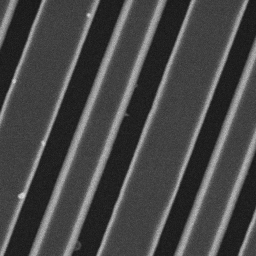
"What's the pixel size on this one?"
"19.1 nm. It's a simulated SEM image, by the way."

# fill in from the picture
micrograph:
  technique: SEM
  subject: lines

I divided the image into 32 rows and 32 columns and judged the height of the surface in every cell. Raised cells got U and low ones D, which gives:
UUDDDUUUUUUUDDDDUUUUDDDDUUUUUUUD
UUDDDUUUUUUUDDDUUUUUDDDUUUUUUUUD
UDDDUUUUUUUUDDDUUUUUDDDUUUUUUUDD
UDDDUUUUUUUDDDUUUUUDDDDUUUUUUUDD
DDDDUUUUUUUDDDUUUUUDDDUUUUUUUDDD
DDDUUUUUUUDDDDUUUUUDDDUUUUUUUDDD
DDDUUUUUUUDDDUUUUUDDDDUUUUUUUDDU
DDUUUUUUUUDDDUUUUUDDDUUUUUUUDDDU
DDUUUUUUUDDDDUUUUUDDDUUUUUUUDDDU
DDUUUUUUUDDDUUUUUDDDUUUUUUUUDDUU
DUUUUUUUUDDDUUUUUDDDUUUUUUUDDDUU
DUUUUUUUDDDDUUUUDDDDUUUUUUUDDDUU
DUUUUUUUDDDUUUUUDDDUUUUUUUDDDUUU
UUUUUUUDDDDUUUUUDDDUUUUUUUDDDUUU
UUUUUUUDDDUUUUUDDDDUUUUUUUDDUUUU
UUUUUUUDDDUUUUUDDDUUUUUUUDDDUUUU
UUUUUUDDDDUUUUUDDDUUUUUUUDDDUUUU
UUUUUUDDDUUUUUDDDUUUUUUUUDDUUUUU
UUUUUUDDDUUUUUDDDUUUUUUUDDDUUUUU
UUUUUDDDUUUUUDDDDUUUUUUUDDDUUUUU
UUUUUDDDUUUUUDDDUUUUUUUDDDUUUUUD
UUUUDDDDUUUUUDDDUUUUUUUDDDUUUUUD
UUUUDDDUUUUUDDDDUUUUUUUDDUUUUUDD
UUUUDDDUUUUUDDDUUUUUUUDDDUUUUUDD
UUUDDDDUUUUUDDDUUUUUUUDDDUUUUUDD
UUUDDDUUUUUDDDUUUUUUUUDDUUUUUDDD
UUDDDDUUUUUDDDUUUUUUUDDDUUUUUDDD
UUDDDUUUUUDDDDUUUUUUUDDDUUUUUDDU
UUDDDUUUUUDDDUUUUUUUDDDUUUUUDDDU
UDDDDUUUUUDDDUUUUUUUDDDUUUUUDDDU
UDDDUUUUUDDDDUUUUUUUDDUUUUUDDDUU
UDDDUUUUUDDDUUUUUUUDDDUUUUUDDDUU